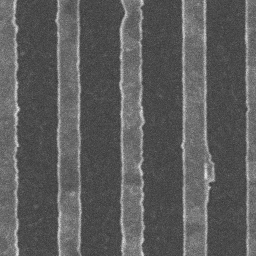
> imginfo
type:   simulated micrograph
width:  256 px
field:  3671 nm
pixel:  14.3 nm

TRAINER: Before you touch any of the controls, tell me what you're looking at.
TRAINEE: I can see one or a few lines or trenches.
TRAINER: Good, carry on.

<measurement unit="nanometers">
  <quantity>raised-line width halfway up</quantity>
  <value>303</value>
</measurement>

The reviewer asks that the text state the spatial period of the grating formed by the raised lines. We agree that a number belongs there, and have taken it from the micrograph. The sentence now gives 904 nm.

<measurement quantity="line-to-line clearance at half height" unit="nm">591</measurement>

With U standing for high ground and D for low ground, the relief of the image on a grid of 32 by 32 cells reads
UUDDDDDUUUDDDDDUUUDDDDDUUUDDDDDU
UUDDDDDUUUDDDDDDUUDDDDDUUUDDDDDU
UUDDDDDUUUDDDDDUUUDDDDDUUUDDDDDU
UUDDDDDUUUDDDDDUUUDDDDDUUUDDDDDU
UUDDDDDUUUDDDDDUUUDDDDDUUUDDDDDU
UUDDDDDUUUDDDDDUUUDDDDDUUUDDDDDU
UUDDDDDUUUDDDDDUUUDDDDDUUUDDDDDU
UUDDDDDUUUDDDDDUUUDDDDDUUUDDDDDU
UUDDDDDUUUDDDDDUUUDDDDDUUUDDDDDU
UUDDDDDUUUDDDDDUUUDDDDDUUUDDDDDU
UUDDDDDUUUDDDDDUUUDDDDDUUUDDDDDU
UUDDDDDUUUDDDDDUUUDDDDDUUUDDDDDU
UUDDDDDUUUDDDDDUUUDDDDDUUUDDDDDU
UUDDDDDUUUDDDDDUUUDDDDDUUUDDDDDU
UUDDDDDUUUDDDDDUUUDDDDDUUUDDDDDU
UUDDDDDUUUDDDDDUUUDDDDDUUUDDDDDU
UUDDDDDUUUDDDDDUUUDDDDDUUUDDDDDU
UUDDDDDUUUDDDDDUUUDDDDDUUUDDDDDU
UUDDDDDUUUDDDDDUUUDDDDDUUUDDDDDU
UUDDDDDUUUDDDDDUUUDDDDDUUUDDDDDU
UUDDDDDUUUDDDDDUUUDDDDDUUUUDDDDU
UUDDDDDUUUDDDDDUUUDDDDDUUUUDDDDU
UUDDDDDUUUDDDDDUUUDDDDDUUUDDDDDU
UUDDDDDUUUDDDDDUUUDDDDDUUUDDDDDU
UUDDDDDUUUDDDDDUUUDDDDDUUUDDDDDU
UUDDDDDUUUDDDDDUUUDDDDDUUUDDDDDU
UUDDDDDUUUDDDDDUUUDDDDDUUUDDDDDU
UUDDDDDUUUDDDDDUUUDDDDDUUUDDDDDU
UUDDDDDUUUDDDDDUUUDDDDDUUUDDDDDU
UUDDDDDUUUDDDDDUUUDDDDDUUUDDDDDU
UUDDDDDUUUDDDDDUUUDDDDDUUUDDDDDU
UUDDDDDUUUDDDDDUUUDDDDDUUUDDDDDU